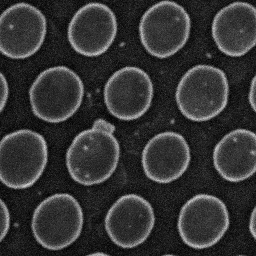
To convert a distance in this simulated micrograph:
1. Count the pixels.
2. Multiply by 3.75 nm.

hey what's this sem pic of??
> a regular array of raised bodies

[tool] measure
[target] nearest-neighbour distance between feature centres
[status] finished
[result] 270 nm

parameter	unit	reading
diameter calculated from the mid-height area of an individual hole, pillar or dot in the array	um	0.191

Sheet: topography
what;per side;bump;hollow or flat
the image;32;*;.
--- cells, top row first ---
....................**.......**.
.****.....****....*****....*****
******...*****....******...*****
******...*****....******...*****
*****....*****....*****....*****
*****....*****....*****....*****
****......***......***......***.
................................
.......*................***.....
.....****.....****.....*****....
*...******...******...******....
*...******...******...******...*
*...******...******...******...*
....******...*****.....*****....
.....****......**......****.....
............**..................
..**.......***...............**.
*****....*****.....****.....****
******...******...******...*****
******..*******...******...*****
******..*******...*****....*****
*****....*****....*****.....****
****......***.......*........*..
................................
.......**.......*........*......
.....*****....****.....*****....
*...******....*****....*****....
*...******...******...******...*
*...******...******...******...*
....******....****.....*****....
.....****......**.......***.....
................................